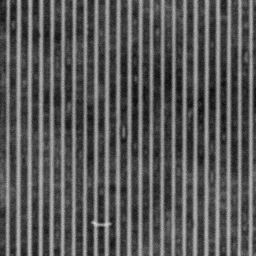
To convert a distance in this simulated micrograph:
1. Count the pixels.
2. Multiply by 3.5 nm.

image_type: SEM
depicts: parallel lines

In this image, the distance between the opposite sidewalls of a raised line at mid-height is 12.7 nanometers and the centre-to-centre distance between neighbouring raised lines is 0.0386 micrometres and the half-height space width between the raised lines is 26.2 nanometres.